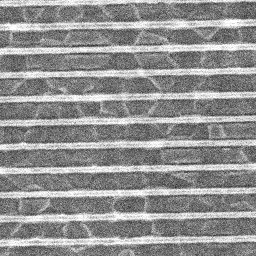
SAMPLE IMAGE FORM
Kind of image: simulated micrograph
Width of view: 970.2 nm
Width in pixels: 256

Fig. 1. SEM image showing parallel lines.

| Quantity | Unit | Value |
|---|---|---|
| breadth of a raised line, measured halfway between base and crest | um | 0.0194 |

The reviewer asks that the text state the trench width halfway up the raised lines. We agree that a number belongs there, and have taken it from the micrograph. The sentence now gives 73.8 nm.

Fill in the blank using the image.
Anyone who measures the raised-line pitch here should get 23.9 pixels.